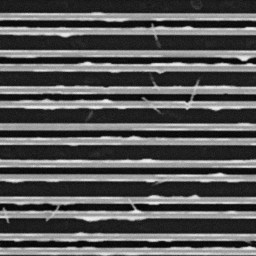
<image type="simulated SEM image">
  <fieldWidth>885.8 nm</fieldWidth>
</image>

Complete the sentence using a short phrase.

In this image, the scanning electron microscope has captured parallel lines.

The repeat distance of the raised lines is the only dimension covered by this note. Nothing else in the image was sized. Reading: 62.7 nm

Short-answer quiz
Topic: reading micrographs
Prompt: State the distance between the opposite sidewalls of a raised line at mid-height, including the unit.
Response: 0.0268 µm